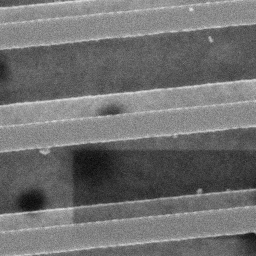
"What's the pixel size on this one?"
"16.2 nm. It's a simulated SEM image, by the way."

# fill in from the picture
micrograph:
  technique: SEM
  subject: lines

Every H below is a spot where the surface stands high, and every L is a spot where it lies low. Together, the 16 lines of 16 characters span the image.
HHHHHHHHHHHHHHHH
HHHHHHHHHHHHHHHH
HHHHHLLLLLLLLLLL
LLLLLLLLLLLLLLLL
LLLLLLLLLLLLLLLL
LLLLLLLLLLLHHHHH
LHHHHHHHHHHHHHHH
HHHHHHHHHHHHHHHH
HHHHHHHHHHLLLLLL
LLLLLLLLLLLLLLLL
LLLLLLLLLLLLLLLL
LLLLLLLLLLLLLLLL
LLLLLLLLLHHHHHHH
HHHHHHHHHHHHHHHH
HHHHHHHHHHHHHHHH
HHHHHLLLLLLLLLLL